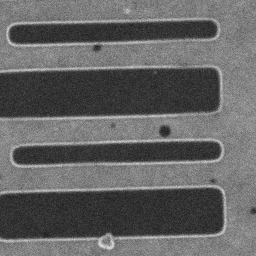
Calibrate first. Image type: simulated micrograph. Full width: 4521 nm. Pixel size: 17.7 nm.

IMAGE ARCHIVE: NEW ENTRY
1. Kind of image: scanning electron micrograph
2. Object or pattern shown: groups of lines, slits or small figures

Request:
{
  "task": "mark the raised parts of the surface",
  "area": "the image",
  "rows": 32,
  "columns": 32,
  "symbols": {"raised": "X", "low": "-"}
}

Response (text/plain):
--------------------------------
--------------------------------
--------------------XXXXXXX-----
-XXXXXXXXXXXXXXXXXXXXXXXXXX-----
-XXXXXXXXXXXXXXXXXXXXXXXXXX-----
-XXXXXXXXX----------------------
--------------------------------
--------------------------------
-----------XXXXXXXXXXXXXXXX-----
XXXXXXXXXXXXXXXXXXXXXXXXXXXX----
XXXXXXXXXXXXXXXXXXXXXXXXXXXX----
XXXXXXXXXXXXXXXXXXXXXXXXXXXX----
XXXXXXXXXXXXXXXXXXXXXXXXXXXX----
XXXXXXXXXXXXXXXXXXXXXXXXXXX-----
XXXXXXXXXXXXXXXXXXXXX-----------
--------------------------------
--------------------------------
-------------------------XX-----
--XXXXXXXXXXXXXXXXXXXXXXXXXX----
-XXXXXXXXXXXXXXXXXXXXXXXXXXX----
--XXXXXXXXX---------------------
--------------------------------
--------------------------------
-----------------XXXXXXXXXX-----
XXXXXXXXXXXXXXXXXXXXXXXXXXXX----
XXXXXXXXXXXXXXXXXXXXXXXXXXXX----
XXXXXXXXXXXXXXXXXXXXXXXXXXXX----
XXXXXXXXXXXXXXXXXXXXXXXXXXXX----
XXXXXXXXXXXXXXXXXXXXXXXXXXXX----
XXXXXXXXXXXXXXXXXXXXXXXXXXX-----
-------------X------------------
--------------------------------